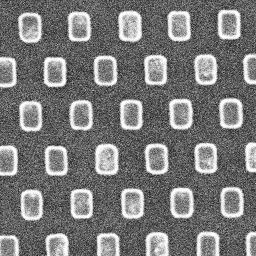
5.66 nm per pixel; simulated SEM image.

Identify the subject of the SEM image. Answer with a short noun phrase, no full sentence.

a regular array of raised bodies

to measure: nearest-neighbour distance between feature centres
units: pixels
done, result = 49.9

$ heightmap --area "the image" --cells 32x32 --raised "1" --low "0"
00000000000000000000000000000000
00000000000000000000000000001000
00011000011000011000011100011100
00011000011000011000011100011100
00011000011000011000011000001100
00000000000000000000000000000000
00000000000000000000000000000000
10000011000011000011100001100001
11000011000011000011100001100001
11000011000011000011100001100001
11000011000001000000000000000000
00000000000000000000000000000000
00000000000000000000000000000000
00011000011000011100011100001100
00011000011000011100011100001100
00011000011000011100001100001100
00000000000000000000000000000000
00000000000000000000000000000000
10000011000011000001100001100001
11000011000011100011100001100001
11000011000011100011100001100001
11000011000001000001000000000000
00000000000000000000000000000000
00000000000000000000000000000000
00011000011000011100001100001100
00011000011000011100001100001100
00011000011000011100001100001100
00000000000000000000000000000000
00000000000000000000000000000000
00000011000001000001100001100001
11000011000011100011100001100001
11000011000011100001100001100001